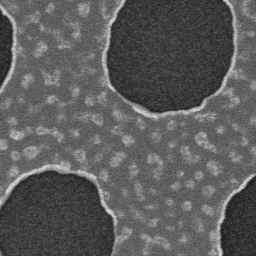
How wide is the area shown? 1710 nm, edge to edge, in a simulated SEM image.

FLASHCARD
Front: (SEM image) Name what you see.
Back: holes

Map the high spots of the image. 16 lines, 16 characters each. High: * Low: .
********......**
.******........*
.******........*
.******........*
.******.......**
*******.......**
********....****
****************
****************
****************
****************
*.....*********.
......********..
.......*******..
.......*******..
.......*******..